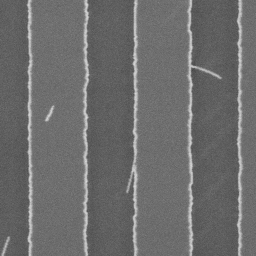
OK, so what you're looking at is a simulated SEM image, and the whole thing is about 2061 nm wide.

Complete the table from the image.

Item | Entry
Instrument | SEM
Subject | lines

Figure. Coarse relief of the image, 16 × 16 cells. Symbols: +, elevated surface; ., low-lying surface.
..+++...++++...+
..+++...++++...+
..+++...++++...+
..+++...++++...+
..++++..++++...+
..+++...++++...+
..+++...++++...+
..+++...++++...+
..+++...++++...+
..+++...++++...+
..+++...++++...+
..+++...++++...+
..+++...++++...+
..+++...++++...+
..+++...++++...+
..+++...++++...+